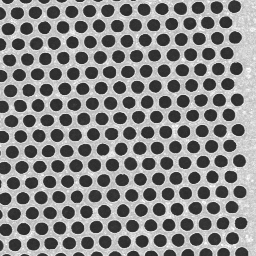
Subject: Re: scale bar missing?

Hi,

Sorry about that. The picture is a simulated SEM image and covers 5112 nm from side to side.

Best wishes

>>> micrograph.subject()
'a regular array of holes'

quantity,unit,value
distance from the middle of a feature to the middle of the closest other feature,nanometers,352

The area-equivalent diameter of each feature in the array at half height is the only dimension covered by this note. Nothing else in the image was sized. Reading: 258 nanometres